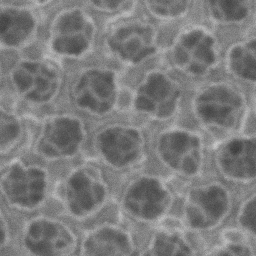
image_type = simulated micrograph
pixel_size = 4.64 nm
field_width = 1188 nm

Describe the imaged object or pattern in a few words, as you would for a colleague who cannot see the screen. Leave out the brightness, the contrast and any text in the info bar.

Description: a regular array of raised bodies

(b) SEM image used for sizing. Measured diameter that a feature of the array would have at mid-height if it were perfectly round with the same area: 217 nm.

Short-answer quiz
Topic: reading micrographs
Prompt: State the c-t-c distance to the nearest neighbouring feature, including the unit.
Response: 272 nm